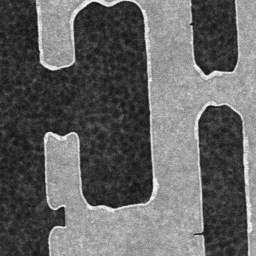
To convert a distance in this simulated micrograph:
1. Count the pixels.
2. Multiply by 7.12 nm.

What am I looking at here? one or a few lines or trenches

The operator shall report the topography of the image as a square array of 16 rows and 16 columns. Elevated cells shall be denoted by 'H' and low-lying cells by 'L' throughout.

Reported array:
LLHHHLLLLHHHLLLH
LLHHHLLLLHHHLLLH
LLHHHLLLLHHHLLLH
LLLHHLLLLHHHLLLH
LLLLLLLLLHHHHLHH
LLLLLLLLLHHHHHHH
LLLLLLLLLHHHHHHH
LLLLLLLLLHHHLLLH
LLLHHLLLLHHHLLLH
LLLHHLLLLHHHLLLH
LLLHHLLLLLHHLLLH
LLLHHLLLLLHHHLLH
LLLHHLLLLHHHHLLH
LLLLHHHHHHHHHLLH
LLLHHHHHHHHHHLLL
LLLHHHHHHHHHHLLL